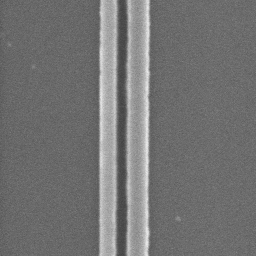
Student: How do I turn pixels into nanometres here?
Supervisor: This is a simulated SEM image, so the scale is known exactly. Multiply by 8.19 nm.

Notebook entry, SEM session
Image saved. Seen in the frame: lines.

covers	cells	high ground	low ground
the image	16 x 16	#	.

......###.......
......###.......
......###.......
......###.......
......###.......
......###.......
......###.......
......###.......
......###.......
......###.......
......###.......
......###.......
......###.......
......###.......
......###.......
......###.......